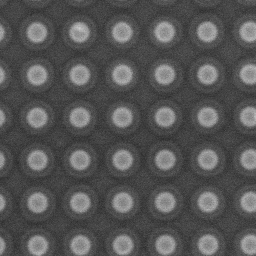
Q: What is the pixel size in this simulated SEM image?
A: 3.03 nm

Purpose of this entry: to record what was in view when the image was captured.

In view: an array of small figures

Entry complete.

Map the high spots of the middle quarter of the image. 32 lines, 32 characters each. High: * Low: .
*******....*******....*******...
********...*******...********..*
********...*******...*********.*
********...*******...*********.*
********...*******...********...
.******.....*****.....*******...
..****.......***.......****.....
................................
................................
..****.......***........***.....
.******.....*****.....******....
********...*******...********...
********...********..********...
********...********..********...
********...********..********...
********...*******...********...
.******.....******....******....
...**...................***.....
................................
................................
..****......*****.....******....
.*******...*******....*******...
********...*******...********...
********..*********..*********..
********..*********..*********..
********...*******...********...
.*******...*******....*******...
..*****.....*****......*****....
................................
................................
...***...................**.....
.******.....*****......*****....